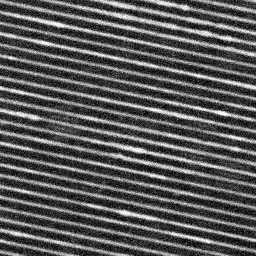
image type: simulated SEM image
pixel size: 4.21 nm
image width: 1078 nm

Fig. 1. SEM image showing parallel lines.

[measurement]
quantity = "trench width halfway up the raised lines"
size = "0.0365 um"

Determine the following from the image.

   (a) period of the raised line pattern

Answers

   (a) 0.0448 microns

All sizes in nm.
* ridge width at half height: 8.2